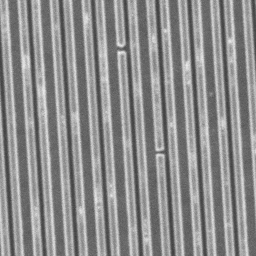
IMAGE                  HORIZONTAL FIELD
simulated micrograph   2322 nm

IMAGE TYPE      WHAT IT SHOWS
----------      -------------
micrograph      parallel lines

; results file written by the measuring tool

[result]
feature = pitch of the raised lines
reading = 145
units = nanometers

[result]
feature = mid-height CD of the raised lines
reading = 7.35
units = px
